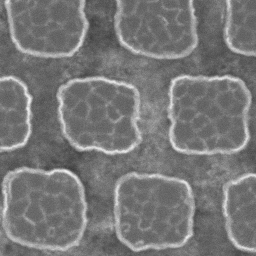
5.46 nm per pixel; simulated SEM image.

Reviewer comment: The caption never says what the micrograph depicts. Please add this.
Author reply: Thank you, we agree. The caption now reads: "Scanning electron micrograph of raised bodies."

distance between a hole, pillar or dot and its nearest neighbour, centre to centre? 594 nm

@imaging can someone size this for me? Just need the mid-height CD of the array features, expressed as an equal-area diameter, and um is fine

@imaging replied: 0.45